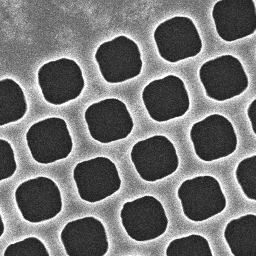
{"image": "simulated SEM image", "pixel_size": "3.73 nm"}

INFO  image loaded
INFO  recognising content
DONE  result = a regular array of holes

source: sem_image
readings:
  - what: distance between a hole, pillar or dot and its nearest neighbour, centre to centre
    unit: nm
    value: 224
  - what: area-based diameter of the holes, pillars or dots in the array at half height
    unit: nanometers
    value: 171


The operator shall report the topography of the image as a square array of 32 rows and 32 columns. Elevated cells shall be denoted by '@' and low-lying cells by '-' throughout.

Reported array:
@@@@@@@@@@@@@@@@@@@@@@@@@@@-----
@@@@@@@@@@@@@@@@@@@@@@@@@@@-----
@@@@@@@@@@@@@@@@@@@@@---@@@-----
@@@@@@@@@@@@@@@@@@@@-----@@-----
@@@@@@@@@@@@@@@@@@@------@@----@
@@@@@@@@@@@@@----@@@-----@@@@@@@
@@@@@@@@@@@@------@@-----@@@@@@@
@@@@@@@--@@@------@@@--@@@@---@@
@@@@@-----@@------@@@@@@@-----@@
@@@@@-----@@@----@@@@-@@@------@
--@@@------@@@@@@@@----@@------@
---@@-----@@@@@@@@-----@@@----@@
---@@@---@@@@--@@@------@@@-@@@@
---@@@@@@@@-----@@------@@@@@@@-
---@@@@@@@@-----@@@----@@@--@@@-
-@@@----@@@------@@@@@@@-----@@-
@@@------@@-----@@@@@@@@-----@@@
-@@------@@@---@@@---@@@------@@
--@@-----@@@@@@@@-----@@-----@@@
--@@----@@@@@@@@------@@@---@@@@
--@@@@@@@@----@@@-----@@@@@@@@--
--@@@@@@@------@@-----@@@@@@@---
@@@@--@@@------@@@--@@@----@@@--
@@-----@@@-----@@@@@@@------@@--
@@------@@----@@@@-@@@------@@@-
@@------@@@@@@@@----@@@-----@@@@
@@@----@@@@@@@@------@@-----@@@@
@@@---@@@@--@@@------@@@-@@@@---
@@@@@@@@-----@@@-----@@@@@@@----
@@@@@@@@-----@@@----@@@@-@@@----
@@---@@@------@@@@@@@-----@@----
@-----@@-----@@@@@@@@-----@@@---